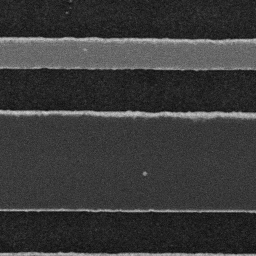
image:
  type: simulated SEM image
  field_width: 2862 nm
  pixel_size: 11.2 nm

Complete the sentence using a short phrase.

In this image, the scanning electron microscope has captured lines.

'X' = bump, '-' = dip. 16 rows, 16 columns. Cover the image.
----------------
----------------
XXXXXXXXXXXXX-XX
XXXXXXXXXXXXXXXX
----------------
----------------
----------------
XXXXXXXXXXXXXXXX
XXXXXXXXXXXXXXXX
XXXXXXXXXXXXXXXX
XXXXXXXXXXXXXXXX
XXXXXXXXXXXXXXXX
XXXXXXXXXXXXXXXX
----------------
----------------
----------------